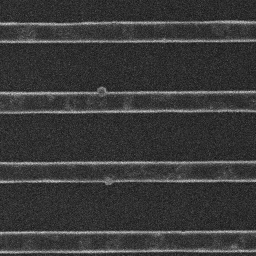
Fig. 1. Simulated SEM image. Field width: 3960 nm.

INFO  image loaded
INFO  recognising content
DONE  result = one or a few lines or trenches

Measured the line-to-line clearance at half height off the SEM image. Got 772 nm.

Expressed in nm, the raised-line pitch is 1080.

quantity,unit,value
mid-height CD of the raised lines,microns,0.303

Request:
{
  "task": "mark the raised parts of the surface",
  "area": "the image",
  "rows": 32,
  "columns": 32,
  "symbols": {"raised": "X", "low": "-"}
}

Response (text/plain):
--------------------------------
--------------------------------
--------------------------------
XXXXXXXXXXXXXXXXXXXXXXXXXXXXXXXX
XXXXXXXXXXXXXXXXXXXXXXXXXXXXXXXX
--------------------------------
--------------------------------
--------------------------------
--------------------------------
--------------------------------
--------------------------------
------------X---------XX-------X
XXXXXXXXXXXXXXXXXXXXXXXXXXXXXXXX
XXXXXXXXXXXXXXXXXXXXXXXXXXXXXXXX
--------------------------------
--------------------------------
--------------------------------
--------------------------------
--------------------------------
--------------------------------
XXXXXXXXXXXXXXXXXXXXXXXXXXXXXXXX
XXXXXXXXXXXXXXXXXXXXXXXXXXXXXXXX
XXXXXXXXXXXXXXXXXXXXXXXXXXXXXXXX
--------------------------------
--------------------------------
--------------------------------
--------------------------------
--------------------------------
--------------------------------
XXXXXXXXXXXXXXXXXXXXXXXXXXXXXXXX
XXXXXXXXXXXXXXXXXXXXXXXXXXXXXXXX
XX------------------------------